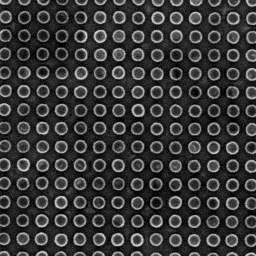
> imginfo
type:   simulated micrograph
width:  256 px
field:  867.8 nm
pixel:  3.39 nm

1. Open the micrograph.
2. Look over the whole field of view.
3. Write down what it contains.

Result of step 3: a regular array of raised bodies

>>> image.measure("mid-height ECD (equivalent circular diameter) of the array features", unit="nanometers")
41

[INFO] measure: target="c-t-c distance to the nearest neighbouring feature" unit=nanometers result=62